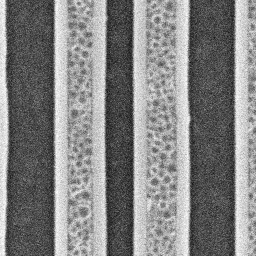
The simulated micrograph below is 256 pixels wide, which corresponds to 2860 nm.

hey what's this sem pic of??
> one or a few lines or trenches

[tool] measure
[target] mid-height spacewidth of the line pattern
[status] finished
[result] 634 nanometres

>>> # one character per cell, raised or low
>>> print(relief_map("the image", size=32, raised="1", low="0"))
00000000111110000111111000000011
00000000111110000111111000000011
00000000111110000111111000000011
00000000111110000111111000000011
00000000111100000111111000000011
00000000111100000111111000000011
00000000111100000111111000000011
00000000111100000111111000000011
00000000111100000111111000000011
00000000111100000111111000000011
00000000111100000111111000000011
00000000111100000111111000000011
00000000111100000111111000000011
00000000111100000111111000000011
00000000111100000111111000000011
00000000111100000111111000000011
00000000111100000111111000000011
00000000111100000111111000000011
00000000111100000111111000000011
00000000111100000111111000000011
00000000111100000111111000000011
00000000111100000111111000000011
00000000111100000111111000000011
00000000111100000111111000000011
00000000111100000111111000000011
00000000111110000111111000000011
00000000111110000111111000000011
00000000111110000111111000000011
00000000111110000111111000000011
00000000111110000111111000000011
00000000111110000111111000000011
00000000111110000111111000000011